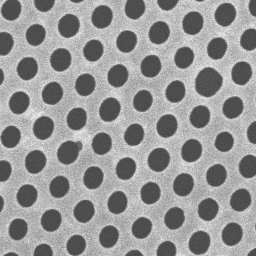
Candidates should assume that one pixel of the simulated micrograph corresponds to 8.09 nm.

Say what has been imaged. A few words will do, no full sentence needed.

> a regular array of holes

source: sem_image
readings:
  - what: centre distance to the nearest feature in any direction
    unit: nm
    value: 275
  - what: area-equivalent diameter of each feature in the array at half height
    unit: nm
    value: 179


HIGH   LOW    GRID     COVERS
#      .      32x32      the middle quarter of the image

.###########...####.....####...#
###########.....###.....########
#####.#####.....####....########
###.....###.....################
###.....###.....###########..###
###.....####...###########....##
###.....#################.....##
####...###########....###.....##
###########..####.....####....##
##########....###.....####..####
#########.....###.....##########
##...####.....####...###########
#.....###.....###########..####.
#.....###....###########....###.
#.....#################.....###.
#....###########...####.....####
##..###########.....###.....####
########...####.....####....####
#######.....###.....#####.######
...####.....###....###########..
....###.....#####.############..
....###.....##########....###...
....####..###########.....###...
...############..####......###..
...##########.....###.....#####.
#############.....###.....######
#####....####.....####...#######
#####.....###.....###########..#
.####.....####...###########....
.####.....###########.#####.....
.####....###########....###.....
.##################.....###.....